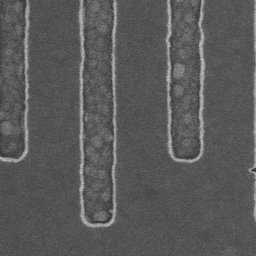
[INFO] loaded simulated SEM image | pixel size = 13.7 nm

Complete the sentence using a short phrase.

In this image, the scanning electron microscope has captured one or a few lines or trenches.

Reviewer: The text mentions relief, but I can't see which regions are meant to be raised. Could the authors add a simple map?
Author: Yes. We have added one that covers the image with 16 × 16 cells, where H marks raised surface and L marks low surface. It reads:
LLHHHLLHHHHLLHHH
LLHHHLLHHHHLHHHH
LLHHHLLHHHHLLHHH
LLHHHLLHHHHLLHHH
LLHHHLLHHHHLLHHH
LLHHHLLHHHHLLHHH
LLHHHLLHHHHLLHHH
LLHHHLLHHHHLLHHH
LLHHHLLHHHHLLHHH
LLHHHLLHHHHLHHHH
HHHHHLLHHHHHHHHH
HHHHHLLHHHHHHHHH
HHHHHLLHHHHHHHHH
HHHHHLLHHHHHHHHH
HHHHHHHHHHHHHHHH
HHHHHHHHHHHHHHHH